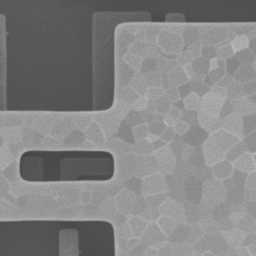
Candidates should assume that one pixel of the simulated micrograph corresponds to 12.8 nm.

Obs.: wiring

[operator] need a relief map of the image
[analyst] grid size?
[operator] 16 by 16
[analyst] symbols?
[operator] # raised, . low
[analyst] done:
................
........########
.......#########
.......#########
.......#########
.......#########
.......#########
################
################
##.....#########
#......#########
################
################
################
.......#########
.......#########